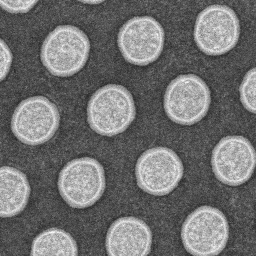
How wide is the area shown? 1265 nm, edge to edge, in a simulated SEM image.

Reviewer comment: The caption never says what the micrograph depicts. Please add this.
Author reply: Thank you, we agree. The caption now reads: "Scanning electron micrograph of a regular array of raised bodies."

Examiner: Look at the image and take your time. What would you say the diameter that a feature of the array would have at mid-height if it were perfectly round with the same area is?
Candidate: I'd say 219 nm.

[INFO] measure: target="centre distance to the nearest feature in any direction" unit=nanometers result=373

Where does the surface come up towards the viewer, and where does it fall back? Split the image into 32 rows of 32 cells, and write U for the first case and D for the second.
UUUUDDDDDDDDDDDDDDDDDDDDDDDDDDDD
DDDDDDDDDDDDDDDDDDDDDDDDDDUUUDDD
DDDDDDDDDDDDDDDDDUUDDDDDDUUUUDDD
DDDDDDDDUDDDDDDDUUUUDDDDDUUUUUDD
DDDDDDUUUUDDDDDUUUUUDDDDUUUUUUDD
DDDDDDUUUUUDDDDUUUUUDDDDDUUUUDDD
UDDDDUUUUUUDDDDUUUUUDDDDDDUUDDDD
UDDDDDUUUUUDDDDDUUUDDDDDDDDDDDDD
UDDDDDUUUUDDDDDDDDDDDDDDDDDDDDDD
DDDDDDDDDDDDDDDDDDDDDDDDDDDDDDDU
DDDDDDDDDDDDDDDDDDDDDDUUUDDDDDUU
DDDDDDDDDDDDUUUUDDDDDUUUUUDDDDUU
DDDDUUDDDDDUUUUUDDDDDUUUUUDDDDUU
DDUUUUUDDDDUUUUUUDDDDUUUUUDDDDDU
DDUUUUUDDDDUUUUUUDDDDUUUUDDDDDDD
DDUUUUUDDDDDUUUUDDDDDDDDDDDDDDDD
DDUUUUUDDDDDDUUDDDDDDDDDDDDDDDDD
DDDUUDDDDDDDDDDDDDDDDDDDDDDDUUDD
DDDDDDDDDDDDDDDDDDDDDDDDDDDUUUUD
DDDDDDDDDDDDDDDDDDUUUUDDDDDUUUUU
DDDDDDDDDUUUDDDDDUUUUUDDDDDUUUUU
UUDDDDDDUUUUUDDDDUUUUUUDDDDUUUUD
UUUDDDDDUUUUUDDDDUUUUUDDDDDDUUUD
UUUDDDDDUUUUUDDDDDUUUDDDDDDDDDDD
UUUDDDDDUUUUDDDDDDDDDDDDDDDDDDDD
UUUDDDDDDUUDDDDDDDDDDDDDDDDDDDDD
UUDDDDDDDDDDDDDDDDDDDDDDDUUDDDDD
DDDDDDDDDDDDDDDUUDDDDDDUUUUUDDDD
DDDDDDDDDDDDDDUUUUDDDDDUUUUUDDDD
DDDDDUUUUDDDDDUUUUUDDDDUUUUUDDDD
DDDDUUUUUDDDDUUUUUUDDDDUUUUUDDDD
DDDDUUUUUDDDDDUUUUDDDDDDUUUDDDDD